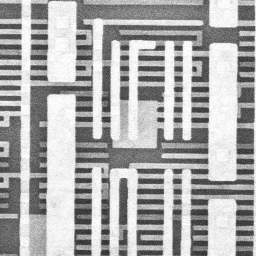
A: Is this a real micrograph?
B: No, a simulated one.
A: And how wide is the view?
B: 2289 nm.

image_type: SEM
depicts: wiring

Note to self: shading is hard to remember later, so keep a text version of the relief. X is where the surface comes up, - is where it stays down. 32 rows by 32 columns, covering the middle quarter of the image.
XXX----XX---XX---X-------XX---XX
XXX----XX---XX---X-------XX---XX
XXX----XX---XX---X-------XX---XX
XXX----XX---XX---X-------XX---XX
-------XX---XX---X-------XX---XX
-------XX---XX---X-------XX---XX
-------XX---XX---X-------XX---XX
-------XX---XX---X-------XX---XX
XXX----XX---XX---X-------XX---XX
XXX----XX---XX--XX-------XX---XX
XXX----XX---XX--XX-------XX---XX
XXX----XX---XX--XX-------XX---XX
XXX----XX---XX--XX-------XX---XX
XXX----XX---XX--XX-------XX---XX
XXX----XX---XX--XX-------XX---XX
XXX----XX---XX--XX-------XX---XX
XXX----XX---XX--XX-------XX---XX
XXX----XX---XX--XX-------XX---XX
XXX-----X---XX--XX-------XX---XX
XXX-----------------------------
XXX-----------------------------
XXX-----------------------------
XXX-----------------------------
XXX-----------------------------
XXX-----------------------------
XXX-----------------------------
XX-----XX---XXXXXX--------------
XX-----XX---XXXXXX-------XX---XX
XX-----XX---XXXXXX-------XX---XX
XX-----XX---XX--XX-------XX---XX
XX-----XX---XX--XX-------XX---XX
XX-----XX---XX--XX-------XX---XX